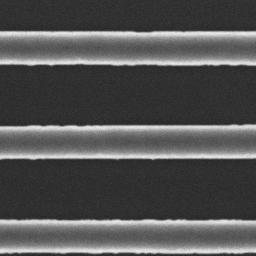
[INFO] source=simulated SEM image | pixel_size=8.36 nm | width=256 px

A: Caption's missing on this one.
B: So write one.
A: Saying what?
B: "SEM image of lines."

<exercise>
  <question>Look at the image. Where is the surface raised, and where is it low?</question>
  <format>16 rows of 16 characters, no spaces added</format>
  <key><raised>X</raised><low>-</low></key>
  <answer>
----------------
----------------
XXXXXXXXXXXXXXXX
XXXXXXXXXXXXXXXX
----------------
----------------
----------------
----------------
XXXXXXXXXXXXXXXX
XXXXXXXXXXXXXXXX
----------------
----------------
----------------
----------------
XXXXXXXXXXXXXXXX
XXXXXXXXXXXXXXXX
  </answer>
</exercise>